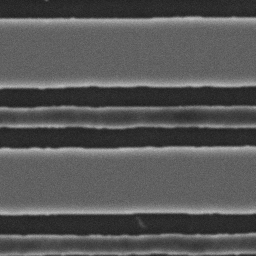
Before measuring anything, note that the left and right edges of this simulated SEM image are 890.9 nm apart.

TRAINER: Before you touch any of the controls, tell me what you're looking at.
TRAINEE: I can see lines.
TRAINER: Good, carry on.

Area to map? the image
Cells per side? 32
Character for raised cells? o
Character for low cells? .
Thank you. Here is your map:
................................
................................
oooooooooooooooooooooooooooooooo
oooooooooooooooooooooooooooooooo
oooooooooooooooooooooooooooooooo
oooooooooooooooooooooooooooooooo
oooooooooooooooooooooooooooooooo
oooooooooooooooooooooooooooooooo
oooooooooooooooooooooooooooooooo
oooooooooooooooooooooooooooooooo
oooooooooooooooooooooooooooooooo
................................
................................
o...oooooooooooooooooooooooooooo
oooooooooooooooooooooooooooooooo
oooooooooooooooooooooooooooooooo
................................
................................
..................oooooooooooooo
oooooooooooooooooooooooooooooooo
oooooooooooooooooooooooooooooooo
oooooooooooooooooooooooooooooooo
oooooooooooooooooooooooooooooooo
oooooooooooooooooooooooooooooooo
oooooooooooooooooooooooooooooooo
oooooooooooooooooooooooooooooooo
oooooooooooooooooooooooooooooooo
................................
................................
oooooooooo.ooo.o.ooooooooooooooo
oooooooooooooooooooooooooooooooo
oooooooooooooooooooooooooooooooo